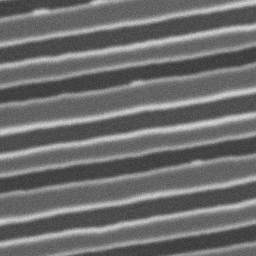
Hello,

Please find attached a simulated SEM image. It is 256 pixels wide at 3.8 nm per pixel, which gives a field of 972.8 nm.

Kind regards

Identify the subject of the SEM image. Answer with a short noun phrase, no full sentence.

lines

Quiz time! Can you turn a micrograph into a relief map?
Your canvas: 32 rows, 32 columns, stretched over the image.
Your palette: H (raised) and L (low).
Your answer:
LLLLLLLLLLLHHHHHHHHHHHHHHHHHHHHL
LLLLLLHHHHHHHHHHHHHHHHHHHHLLLLLL
HHHHHHHHHHHHHHHHHHHHLLLLLLLLLLLL
HHHHHHHHHHHHHHLLLLLLLLLLLLLLLHHH
HHHHHHHLLLLLLLLLLLLLLLLHHHHHHHHH
HHLLLLLLLLLLLLLLLLHHHHHHHHHHHHHH
LLLLLLLLLLLLHHHHHHHHHHHHHHHHLLLL
LLLLHHHHHHHHHHHHHHHHHHLLLLLLLLLL
HHHHHHHHHHHHHHHLLLLLLLLLLLLLLHHH
HHHHHHHHHHLLLLLLLLLLLLLLHHHHHHHH
HHHLLLLLLLLLLLLLLHHHHHHHHHHHHHHH
LLLLLLLLLLLHHHHHHHHHHHHHHHHHHHHH
LLLLLHHHHHHHHHHHHHHHHHHHHHLLLLLL
HHHHHHHHHHHHHHHHHHHLLLLLLLLLLLLL
HHHHHHHHHHHHHHLLLLLLLLLLLLLLLLHH
HHHHHHHHLLLLLLLLLLLLLLLLLHHHHHHH
HLLLLLLLLLLLLLLLLHHHHHHHHHHHHHHH
LLLLLLLLLLLLHHHHHHHHHHHHHHHHHLLL
LLLLLHHHHHHHHHHHHHHHHHHLLLLLLLLL
HHHHHHHHHHHHHHHHHLLLLLLLLLLLLLLH
HHHHHHHHHHLLLLLLLLLLLLLLHHHHHHHH
HHHHLLLLLLLLLLLLLLHHHHHHHHHHHHHH
LLLLLLLLLLLLLHHHHHHHHHHHHHHHHHHH
LLLLLHHHHHHHHHHHHHHHHHHHHHLLLLLL
HHHHHHHHHHHHHHHHHHHHLLLLLLLLLLLL
HHHHHHHHHHHHHHHLLLLLLLLLLLLLLLHH
HHHHHHHHLLLLLLLLLLLLLLLLHHHHHHHH
HHHLLLLLLLLLLLLLLLHHHHHHHHHHHHHH
LLLLLLLLLLLLLHHHHHHHHHHHHHHHHLLL
LLLLLHHHHHHHHHHHHHHHHHHLLLLLLLLL
HHHHHHHHHHHHHHHHHLLLLLLLLLLLLLHH
HHHHHHHHHHHLLLLLLLLLLLLLLHHHHHHH